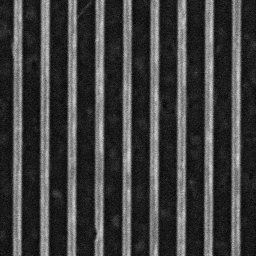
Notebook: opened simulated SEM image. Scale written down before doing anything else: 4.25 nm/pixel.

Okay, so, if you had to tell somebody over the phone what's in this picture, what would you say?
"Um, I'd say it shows parallel lines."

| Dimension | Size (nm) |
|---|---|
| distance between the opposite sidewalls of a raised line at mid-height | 34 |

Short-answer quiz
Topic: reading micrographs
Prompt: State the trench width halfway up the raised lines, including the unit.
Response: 84.9 nanometers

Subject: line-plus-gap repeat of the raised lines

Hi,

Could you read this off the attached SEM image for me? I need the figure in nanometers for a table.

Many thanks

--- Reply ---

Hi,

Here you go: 116